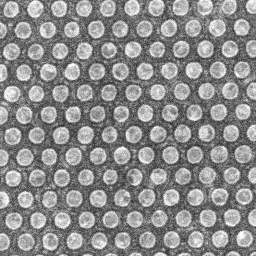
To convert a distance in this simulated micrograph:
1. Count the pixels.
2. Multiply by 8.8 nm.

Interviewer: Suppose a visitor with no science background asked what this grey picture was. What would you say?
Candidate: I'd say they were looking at a regular array of raised bodies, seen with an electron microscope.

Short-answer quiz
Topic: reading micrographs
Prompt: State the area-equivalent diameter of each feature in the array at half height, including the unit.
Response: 132 nanometres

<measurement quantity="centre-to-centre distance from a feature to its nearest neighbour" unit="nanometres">209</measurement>